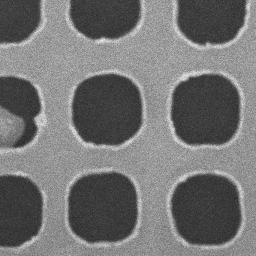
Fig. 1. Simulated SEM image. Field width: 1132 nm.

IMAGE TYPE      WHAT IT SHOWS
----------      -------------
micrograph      holes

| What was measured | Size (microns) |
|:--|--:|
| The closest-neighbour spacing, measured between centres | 0.434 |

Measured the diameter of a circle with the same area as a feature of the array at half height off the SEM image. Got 74.3 pixels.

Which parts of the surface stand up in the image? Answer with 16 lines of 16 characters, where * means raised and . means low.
...*.....**....*
..***....**....*
..**********..**
****************
****************
..***....**....*
...*.....**....*
..**.....**....*
..***...***....*
****************
****************
..***...***....*
...*.....**....*
...*.....**....*
..***...***....*
****************